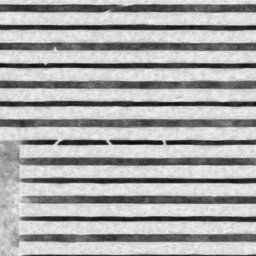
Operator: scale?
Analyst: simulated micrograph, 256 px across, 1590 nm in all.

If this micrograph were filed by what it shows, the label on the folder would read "parallel lines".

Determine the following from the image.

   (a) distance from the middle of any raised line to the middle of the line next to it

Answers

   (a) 119 nanometres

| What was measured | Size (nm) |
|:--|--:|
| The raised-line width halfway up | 81.5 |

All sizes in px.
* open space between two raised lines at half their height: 6.62